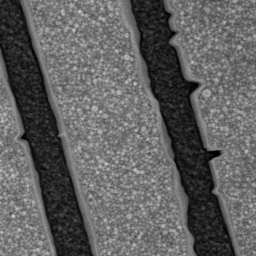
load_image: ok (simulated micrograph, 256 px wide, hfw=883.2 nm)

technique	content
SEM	one or a few lines or trenches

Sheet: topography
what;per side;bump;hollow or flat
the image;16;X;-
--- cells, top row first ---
--XXXXXX---XXXXX
--XXXXXX---XXXXX
--XXXXXXX--XXXXX
--XXXXXXX--XXXXX
---XXXXXX---XXXX
X--XXXXXX---XXXX
X--XXXXXXX--XXXX
X---XXXXXX--XXXX
X---XXXXXX---XXX
XX--XXXXXXX--XXX
XX--XXXXXXX--XXX
XX---XXXXXX--XXX
XXX--XXXXXX---XX
XXX--XXXXXXX--XX
XXX---XXXXXX--XX
XXX---XXXXXX---X